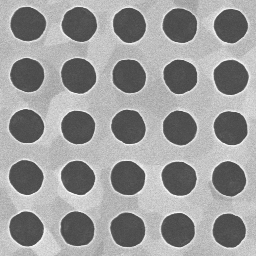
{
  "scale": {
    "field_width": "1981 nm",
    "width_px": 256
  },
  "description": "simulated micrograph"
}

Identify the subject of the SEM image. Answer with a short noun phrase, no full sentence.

a regular array of holes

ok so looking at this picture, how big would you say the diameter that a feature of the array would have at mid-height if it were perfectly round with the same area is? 266 nm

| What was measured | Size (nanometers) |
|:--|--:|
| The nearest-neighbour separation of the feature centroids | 391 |